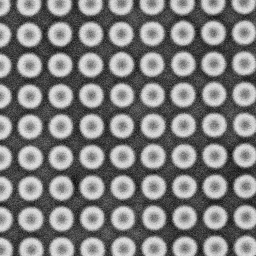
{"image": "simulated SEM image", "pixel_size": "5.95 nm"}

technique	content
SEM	an array of small figures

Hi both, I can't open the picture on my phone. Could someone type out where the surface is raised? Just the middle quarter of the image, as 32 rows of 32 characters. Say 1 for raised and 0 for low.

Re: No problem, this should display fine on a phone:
11001111110011111001111110011111
11001111100011111001111110011111
10000111000001110000111100001110
00000000000000000000000000000000
00000000000000000000000000000000
00000111000001110000011100001111
11001111100011111000111110011111
11001111110011111001111110011111
11001111110011111001111110011111
11001111100011111000111110011111
10000011000000100000001000000110
00000000000000000000000000000000
00000000000000000000000000000000
10000111100011110000111100001111
11001111100011111000111110011111
11001111110011111001111110011111
11001111110011111001111110011111
10000111100011110000111100001111
00000000000000000000000000000000
00000000000000000000000000000000
00000000000000110000011100000110
10000111100011111000111110001111
11001111110011111001111110011111
11001111110011111001111110011111
11001111110011111000111110011111
10000111100001110000011100001111
00000000000000000000000000000000
00000000000000000000000000000000
10000111100001110000011100001111
11001111110011111000111110001111
11001111110011111000111110011111
11001111110011111000111110011111